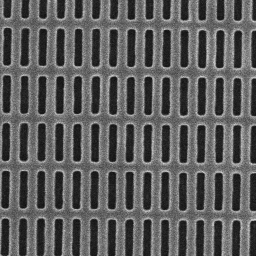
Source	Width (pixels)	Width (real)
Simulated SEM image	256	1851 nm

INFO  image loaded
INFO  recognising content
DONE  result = a regular array of holes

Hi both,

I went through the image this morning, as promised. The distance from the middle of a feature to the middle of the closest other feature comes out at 128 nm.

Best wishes